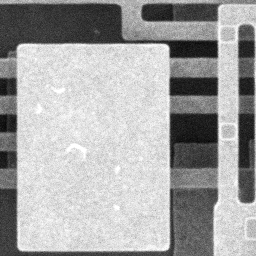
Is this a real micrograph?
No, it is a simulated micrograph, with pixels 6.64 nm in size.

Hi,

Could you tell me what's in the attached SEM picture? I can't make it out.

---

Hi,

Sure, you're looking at wiring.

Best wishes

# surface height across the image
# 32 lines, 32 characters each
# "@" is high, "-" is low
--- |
---------------@@@---------@@@@@
---------------@@@---------@@@@@
---------------@@@---------@@@@@
---------------@@@@@@@@@@@@@@@@@
---------------@@@@@@@@@@@@@@@@@
---------------------------@@@--
--@@@@@@@@@@@@@@@@@@@------@@@--
@@@@@@@@@@@@@@@@@@@@@@@@@@@@@@@@
@@@@@@@@@@@@@@@@@@@@@@@@@@@@@@@@
@@@@@@@@@@@@@@@@@@@@@@@@@@@@@@@@
--@@@@@@@@@@@@@@@@@@@------@@@--
--@@@@@@@@@@@@@@@@@@@------@@@--
@@@@@@@@@@@@@@@@@@@@@@@@@@@@@@@@
@@@@@@@@@@@@@@@@@@@@@@@@@@@@@@@@
--@@@@@@@@@@@@@@@@@@@------@@@--
--@@@@@@@@@@@@@@@@@@@------@@@--
--@@@@@@@@@@@@@@@@@@@------@@@--
@@@@@@@@@@@@@@@@@@@@@------@@@--
@@@@@@@@@@@@@@@@@@@@@------@@@--
--@@@@@@@@@@@@@@@@@@@------@@@--
--@@@@@@@@@@@@@@@@@@@------@@@--
@@@@@@@@@@@@@@@@@@@@@@@@@@@@@@@@
@@@@@@@@@@@@@@@@@@@@@@@@@@@@@@@@
--@@@@@@@@@@@@@@@@@@@@-----@@@@@
--@@@@@@@@@@@@@@@@@@@------@@@@@
--@@@@@@@@@@@@@@@@@@@------@@@@@
--@@@@@@@@@@@@@@@@@@@------@@@@@
--@@@@@@@@@@@@@@@@@@@------@@@@@
--@@@@@@@@@@@@@@@@@@@------@@@@@
--@@@@@@@@@@@@@@@@@@@------@@@@@
--@@@@@@@@@@@@@@@@@@@------@@@@@
---------------------------@@@@@